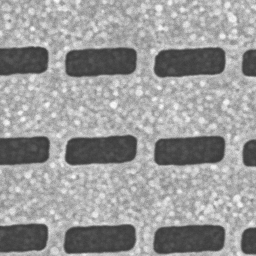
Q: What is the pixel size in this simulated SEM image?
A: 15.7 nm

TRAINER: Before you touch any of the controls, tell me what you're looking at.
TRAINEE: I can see holes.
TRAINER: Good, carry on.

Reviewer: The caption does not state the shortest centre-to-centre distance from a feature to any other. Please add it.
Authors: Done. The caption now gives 1380 nm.